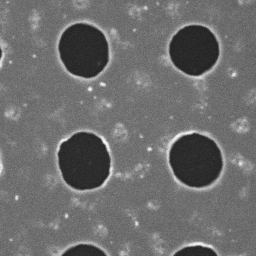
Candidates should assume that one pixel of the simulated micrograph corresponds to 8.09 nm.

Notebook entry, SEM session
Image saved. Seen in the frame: holes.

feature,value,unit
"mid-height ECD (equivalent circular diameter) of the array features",429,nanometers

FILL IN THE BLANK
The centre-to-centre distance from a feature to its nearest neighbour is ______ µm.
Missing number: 0.893